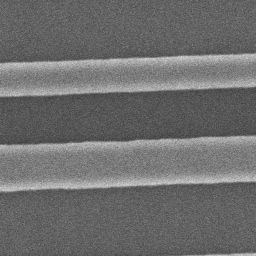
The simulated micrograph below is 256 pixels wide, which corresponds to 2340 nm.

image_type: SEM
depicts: lines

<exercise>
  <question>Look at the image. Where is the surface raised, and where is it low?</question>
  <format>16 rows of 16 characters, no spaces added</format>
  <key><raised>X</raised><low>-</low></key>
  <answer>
----------------
----------------
----------------
-------------XXX
XXXXXXXXXXXXXXXX
XXXXXXXXXXXX----
----------------
----------------
----------------
XXXXXXXXXXXXXXXX
XXXXXXXXXXXXXXXX
XXXXXXXXXX------
----------------
----------------
----------------
----------------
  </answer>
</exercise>